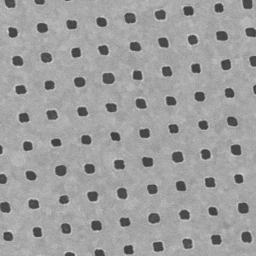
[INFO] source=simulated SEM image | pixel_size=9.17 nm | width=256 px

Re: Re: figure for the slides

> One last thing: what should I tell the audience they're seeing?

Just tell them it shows a regular array of holes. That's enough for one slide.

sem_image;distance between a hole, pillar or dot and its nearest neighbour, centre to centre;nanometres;261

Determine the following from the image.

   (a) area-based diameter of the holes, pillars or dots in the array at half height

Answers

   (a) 102 nanometres